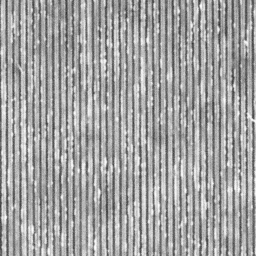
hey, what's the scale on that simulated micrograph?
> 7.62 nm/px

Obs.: parallel lines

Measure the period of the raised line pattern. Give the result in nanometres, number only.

50.6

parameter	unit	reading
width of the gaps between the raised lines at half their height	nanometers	21.9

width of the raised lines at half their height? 27.6 nanometres